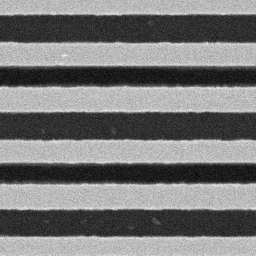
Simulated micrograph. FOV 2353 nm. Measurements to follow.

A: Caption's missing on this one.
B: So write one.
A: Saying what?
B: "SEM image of lines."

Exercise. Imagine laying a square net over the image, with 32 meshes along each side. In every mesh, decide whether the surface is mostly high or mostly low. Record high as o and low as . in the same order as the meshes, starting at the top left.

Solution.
oooooooooooooooooooooooooooooooo
oooooooooooooooooooooooooooooooo
................................
................................
................................
oooooooooooooooooooooooooooooooo
oooooooooooooooooooooooooooooooo
oooooooooooooooooooooooooooooooo
................................
................................
................................
oooooooooooooooooooooooooooooooo
oooooooooooooooooooooooooooooooo
oooooooooooooooooooooooooooooooo
................................
................................
................................
................................
oooooooooooooooooooooooooooooooo
oooooooooooooooooooooooooooooooo
................................
................................
................................
oooooooooooooooooooooooooooooooo
oooooooooooooooooooooooooooooooo
oooooooooooooooooooooooooooooooo
................................
................................
................................
................................
oooooooooooooooooooooooooooooooo
oooooooooooooooooooooooooooooooo